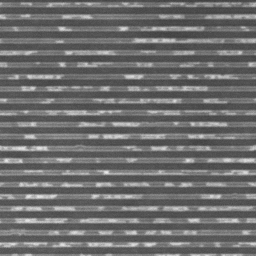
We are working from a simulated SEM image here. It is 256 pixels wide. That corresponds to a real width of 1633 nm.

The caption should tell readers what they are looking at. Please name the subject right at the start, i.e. parallel lines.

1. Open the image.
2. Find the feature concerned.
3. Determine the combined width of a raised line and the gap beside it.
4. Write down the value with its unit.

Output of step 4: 76.5 nanometres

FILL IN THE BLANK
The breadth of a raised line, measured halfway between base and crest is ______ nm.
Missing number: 28.7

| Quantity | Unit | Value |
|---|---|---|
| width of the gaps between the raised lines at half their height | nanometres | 51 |